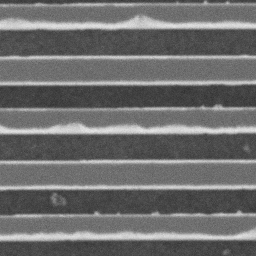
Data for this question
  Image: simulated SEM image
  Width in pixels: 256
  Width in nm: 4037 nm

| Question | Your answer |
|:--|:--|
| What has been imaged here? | lines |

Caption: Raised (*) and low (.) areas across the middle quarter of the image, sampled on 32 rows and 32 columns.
********************************
********************************
********************************
********************************
********************************
................................
................................
................................
................................
................................
................................
********************************
********************************
********************************
********************************
********************************
********************************
................................
................................
................................
................................
................................
................................
................................
********************************
********************************
********************************
********************************
********************************
********************************
********************************
................................